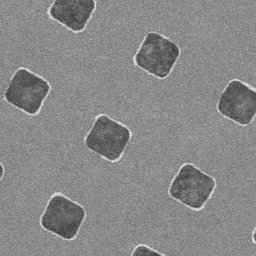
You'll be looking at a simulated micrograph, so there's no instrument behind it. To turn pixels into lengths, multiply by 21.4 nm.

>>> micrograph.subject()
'holes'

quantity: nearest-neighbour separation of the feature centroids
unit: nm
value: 1990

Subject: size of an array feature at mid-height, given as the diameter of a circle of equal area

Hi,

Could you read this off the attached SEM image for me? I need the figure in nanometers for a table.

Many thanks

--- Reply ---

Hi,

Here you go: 876